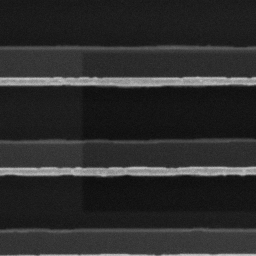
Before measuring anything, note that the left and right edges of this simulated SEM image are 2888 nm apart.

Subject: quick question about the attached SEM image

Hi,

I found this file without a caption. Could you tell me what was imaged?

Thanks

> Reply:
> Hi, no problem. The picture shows lines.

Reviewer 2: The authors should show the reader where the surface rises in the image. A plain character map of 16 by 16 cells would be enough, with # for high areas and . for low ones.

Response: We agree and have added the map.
................
................
................
################
################
................
................
................
................
################
################
................
................
................
################
################